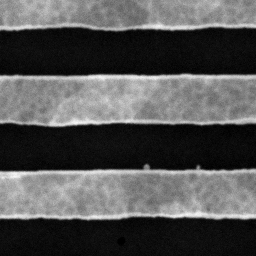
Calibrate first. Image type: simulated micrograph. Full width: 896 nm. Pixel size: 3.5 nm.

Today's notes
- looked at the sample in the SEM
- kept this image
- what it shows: lines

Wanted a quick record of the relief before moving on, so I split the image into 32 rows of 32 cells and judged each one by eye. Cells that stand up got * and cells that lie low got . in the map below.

********************************
********************************
********************************
***........******....***........
................................
................................
................................
................................
................................
............*.**.....*****.*****
********************************
********************************
********************************
********************************
********************************
...******................*......
................................
................................
................................
................................
................................
.....***************************
********************************
********************************
********************************
********************************
********************************
................................
................................
................................
................................
................................